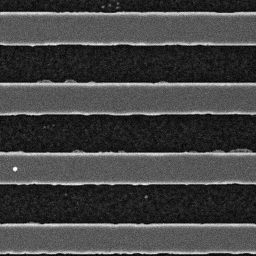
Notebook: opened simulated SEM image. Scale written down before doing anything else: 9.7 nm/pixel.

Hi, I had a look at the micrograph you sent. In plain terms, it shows lines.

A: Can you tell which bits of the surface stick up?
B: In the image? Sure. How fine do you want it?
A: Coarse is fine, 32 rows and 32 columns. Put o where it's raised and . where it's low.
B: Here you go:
................................
................................
oooooooooooooooooooooooooooooooo
oooooooooooooooooooooooooooooooo
oooooooooooooooooooooooooooooooo
oooooooo..ooooo.oooooooooooooooo
................................
................................
................................
................................
oooooooooooooooooooooooooooooooo
oooooooooooooooooooooooooooooooo
oooooooooooooooooooooooooooooooo
oooooooooooooooooooooooooooooooo
................................
................................
................................
................................
................................
oooooooooooooooooooooooooooooooo
oooooooooooooooooooooooooooooooo
oooooooooooooooooooooooooooooooo
oooooooooooooooooooooooooooooooo
................................
................................
................................
................................
................................
oooooooooooooooooooooooooooooooo
oooooooooooooooooooooooooooooooo
oooooooooooooooooooooooooooooooo
oooooooooooooooooooooooooooooooo